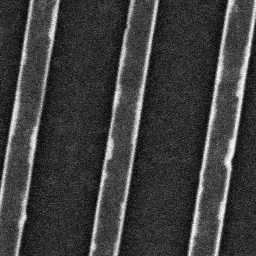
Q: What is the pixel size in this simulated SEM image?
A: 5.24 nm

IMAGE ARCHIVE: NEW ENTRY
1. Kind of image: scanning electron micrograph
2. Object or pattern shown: one or a few lines or trenches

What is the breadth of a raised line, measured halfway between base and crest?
136 nm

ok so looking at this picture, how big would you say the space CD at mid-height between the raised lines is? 72.2 px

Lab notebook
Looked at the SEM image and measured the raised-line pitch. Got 513 nm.